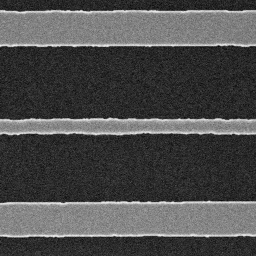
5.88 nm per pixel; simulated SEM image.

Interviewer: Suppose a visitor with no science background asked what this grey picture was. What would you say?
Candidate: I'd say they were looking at lines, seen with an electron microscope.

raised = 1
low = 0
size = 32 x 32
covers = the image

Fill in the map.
00000000000000000000000000000000
11111111111111111111111111111111
11111111111111111111111111111111
11111111111111111111111111111111
11111111111111111111111111111111
11111111111111111111111111111111
00000000000000000000000000000000
00000000000000000000000000000000
00000000000000000000000000000000
00000000000000000000000000000000
00000000000000000000000000000000
00000000000000000000000000000000
00000000000000000000000000000000
00000000000000000000000000000000
00000000000000000000000000000000
11111111111111111111111111111111
11111111111111111111111111111111
00000000000000000000000000000000
00000000000000000000000000000000
00000000000000000000000000000000
00000000000000000000000000000000
00000000000000000000000000000000
00000000000000000000000000000000
00000000000000000000000000000000
00000000000000000000000000000000
11111111111111111111111111111111
11111111111111111111111111111111
11111111111111111111111111111111
11111111111111111111111111111111
11111111111111111101111111111101
00000000000000000000000000000000
00000000000000000000000000000000